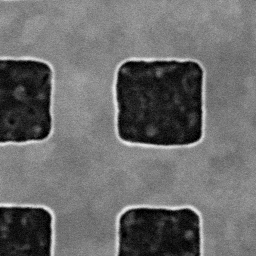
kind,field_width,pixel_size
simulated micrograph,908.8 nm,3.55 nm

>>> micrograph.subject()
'holes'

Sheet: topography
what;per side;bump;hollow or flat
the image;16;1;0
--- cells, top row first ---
1111111111111111
1111111111111111
1111111111111111
1111111111111111
0001111000000111
0001111000000111
0001111000000111
0001111000000111
0001111100000111
1111111111111111
1111111111111111
1111111111111111
1111111111111111
0001111100001111
0001111000000111
0001111000000111